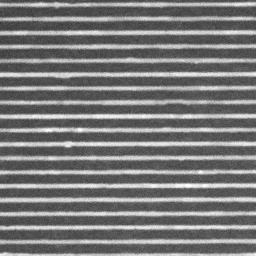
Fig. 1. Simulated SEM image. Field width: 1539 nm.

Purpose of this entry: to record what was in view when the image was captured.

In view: parallel lines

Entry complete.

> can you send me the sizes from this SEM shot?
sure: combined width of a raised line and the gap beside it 83.8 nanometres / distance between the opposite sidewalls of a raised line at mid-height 17.3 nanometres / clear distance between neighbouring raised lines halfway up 68.4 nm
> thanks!